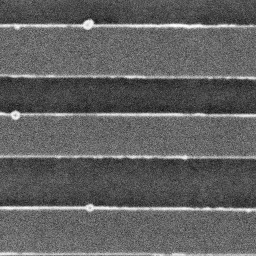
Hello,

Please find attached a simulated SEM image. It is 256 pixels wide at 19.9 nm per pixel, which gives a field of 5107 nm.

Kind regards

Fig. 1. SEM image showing lines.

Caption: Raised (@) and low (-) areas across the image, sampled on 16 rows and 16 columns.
----------------
-----@----------
@@@@@@@@@@@@@@@@
@@@@@@@@@@@@@@@@
@@@@@@@@@@@@@@@@
----------------
----------------
@@@@@@@@@@@@@@@@
@@@@@@@@@@@@@@@@
@@@@@@@@@@@@@@@@
----------------
----------------
----------------
@@@@@@@@@@@@@@@@
@@@@@@@@@@@@@@@@
@@@@@@@@@@@@@@@@